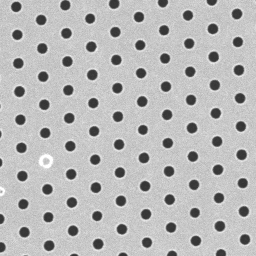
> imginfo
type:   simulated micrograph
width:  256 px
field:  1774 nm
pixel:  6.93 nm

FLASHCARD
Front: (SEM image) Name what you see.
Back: a regular array of holes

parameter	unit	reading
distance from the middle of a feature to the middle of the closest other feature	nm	194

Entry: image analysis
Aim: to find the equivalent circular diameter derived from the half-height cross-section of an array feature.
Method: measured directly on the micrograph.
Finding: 75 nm